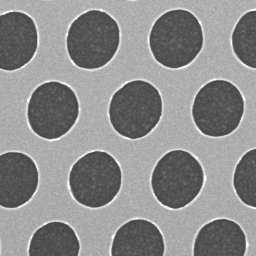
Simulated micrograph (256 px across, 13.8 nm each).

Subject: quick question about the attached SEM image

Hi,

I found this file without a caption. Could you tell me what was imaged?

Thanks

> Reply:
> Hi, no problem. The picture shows holes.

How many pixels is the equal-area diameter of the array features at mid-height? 54.2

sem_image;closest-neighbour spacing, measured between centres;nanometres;1120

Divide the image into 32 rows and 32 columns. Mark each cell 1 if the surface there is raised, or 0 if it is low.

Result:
11111111111111111111111111111111
11111111111001111111100011111110
00001111100000111111000001111100
00000111100000011110000001111000
00000111000000011110000001111000
00000111000000011110000001111000
00001111100000111110000001111000
00001111100000111111000011111100
00011111110011111111101111111111
11111111111111111111111111111111
11111000111111110001111111000111
11110000011111100000111110000011
11110000001111000000111100000011
11100000001111000000111100000001
11100000001111000000111100000011
11110000011111000000111100000011
11110000111111100001111110000111
11111111111111111111111111111111
11111111111111111111111111111111
00011111110000111111000011111100
00001111100000011111000001111100
00000111100000011110000001111000
00000111100000011110000001111000
00000111100000011110000001111000
00001111100000111110000001111100
00011111110001111111000011111110
11111111111111111111111111111111
11111111111111111011111111100111
11111000011111100000111110000011
11110000001111000000111110000001
11110000001111000000111100000001
11110000001111000000011100000001